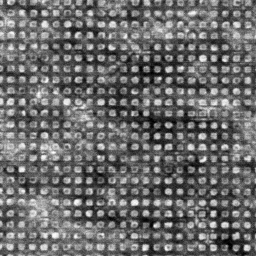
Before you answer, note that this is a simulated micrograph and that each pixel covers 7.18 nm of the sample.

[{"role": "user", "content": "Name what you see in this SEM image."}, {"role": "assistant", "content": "a regular array of raised bodies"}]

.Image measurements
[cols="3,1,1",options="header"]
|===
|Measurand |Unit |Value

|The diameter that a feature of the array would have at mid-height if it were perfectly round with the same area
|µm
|0.0437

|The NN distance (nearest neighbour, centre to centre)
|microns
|0.079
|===